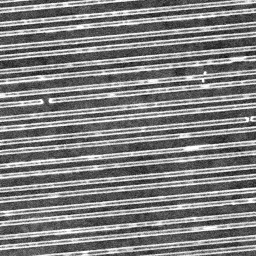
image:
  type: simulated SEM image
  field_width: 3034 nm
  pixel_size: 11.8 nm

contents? parallel lines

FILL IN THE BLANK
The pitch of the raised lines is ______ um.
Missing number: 0.14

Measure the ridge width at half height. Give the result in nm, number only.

53.1